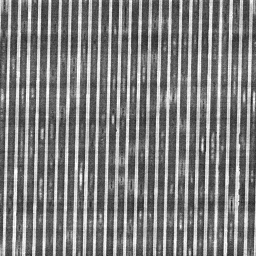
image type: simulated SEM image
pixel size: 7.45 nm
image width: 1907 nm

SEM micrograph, parallel lines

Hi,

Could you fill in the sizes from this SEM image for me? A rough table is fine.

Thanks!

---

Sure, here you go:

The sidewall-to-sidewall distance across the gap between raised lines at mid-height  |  58.7 nm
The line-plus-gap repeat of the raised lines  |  75 nanometers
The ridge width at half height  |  21.4 nm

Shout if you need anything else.